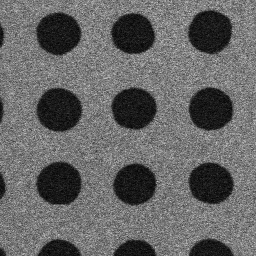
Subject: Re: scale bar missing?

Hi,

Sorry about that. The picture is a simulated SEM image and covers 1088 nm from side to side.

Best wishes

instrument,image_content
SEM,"a regular array of holes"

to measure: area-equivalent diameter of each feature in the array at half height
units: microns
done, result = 0.183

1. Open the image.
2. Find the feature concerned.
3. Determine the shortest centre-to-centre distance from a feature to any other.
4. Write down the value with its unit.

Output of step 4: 317 nm